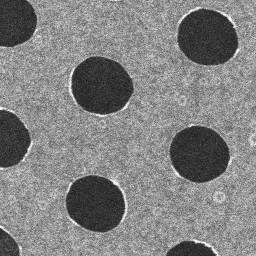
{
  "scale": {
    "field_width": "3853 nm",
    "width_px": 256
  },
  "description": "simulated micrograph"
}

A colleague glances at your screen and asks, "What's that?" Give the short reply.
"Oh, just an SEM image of holes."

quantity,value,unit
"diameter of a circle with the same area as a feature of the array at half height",0.887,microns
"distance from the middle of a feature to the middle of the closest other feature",1740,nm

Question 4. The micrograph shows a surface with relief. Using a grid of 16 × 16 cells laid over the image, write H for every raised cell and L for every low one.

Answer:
LLHHHHHHHHHHHHHH
LLHHHHHHHHHLLLHH
LLHHHHHHHHHLLLLH
HHHHHHHHHHHHLLLH
HHHHHLLLHHHHHHHH
HHHHLLLLHHHHHHHH
HHHHHLLLHHHHHHHH
LHHHHHHHHHHHHHHH
LLHHHHHHHHHLLLHH
LLHHHHHHHHHLLLHH
HHHHHHHHHHHLLLHH
HHHHHLLHHHHHHHHH
HHHHLLLLHHHHHHHH
HHHHLLLLHHHHHHHH
HHHHHHHHHHHHHHHH
LHHHHHHHHHHLLHHH